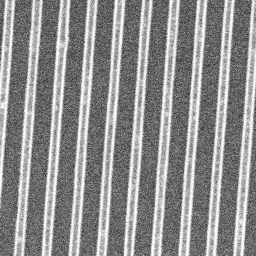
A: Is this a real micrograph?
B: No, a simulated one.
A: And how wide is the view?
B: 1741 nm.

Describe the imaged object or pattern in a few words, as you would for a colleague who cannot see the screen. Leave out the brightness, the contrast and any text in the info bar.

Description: parallel lines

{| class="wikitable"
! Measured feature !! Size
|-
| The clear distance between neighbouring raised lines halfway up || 132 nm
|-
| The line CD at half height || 52.6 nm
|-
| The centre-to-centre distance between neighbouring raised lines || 0.186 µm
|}